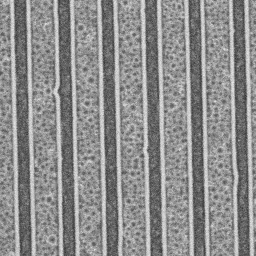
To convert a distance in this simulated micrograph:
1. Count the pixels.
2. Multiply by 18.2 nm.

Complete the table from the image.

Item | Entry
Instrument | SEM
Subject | parallel lines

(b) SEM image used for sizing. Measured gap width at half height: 300 nanometres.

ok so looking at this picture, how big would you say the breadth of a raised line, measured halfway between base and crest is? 0.493 microns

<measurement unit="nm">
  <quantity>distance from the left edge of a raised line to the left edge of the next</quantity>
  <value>793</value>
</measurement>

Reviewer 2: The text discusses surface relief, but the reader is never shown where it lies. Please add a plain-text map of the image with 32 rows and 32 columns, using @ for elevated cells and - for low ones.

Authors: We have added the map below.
@---@@@--@@@---@@@--@@@--@@@@--@
@---@@@--@@@---@@@--@@@--@@@@--@
@---@@@--@@@---@@@--@@@--@@@@--@
@---@@@--@@@---@@@--@@@---@@@--@
@---@@@--@@@---@@@--@@@---@@@--@
@---@@@--@@@---@@@--@@@---@@@--@
@---@@@--@@@---@@@--@@@---@@@--@
@@--@@@--@@@---@@@--@@@---@@@--@
@@--@@@--@@@@--@@@--@@@---@@@--@
@@--@@@--@@@@--@@@--@@@---@@@--@
@@--@@@--@@@---@@@--@@@@--@@@--@
@@--@@@--@@@@--@@@--@@@---@@@--@
@@--@@@--@@@@--@@@--@@@---@@@--@
@@--@@@--@@@@--@@@--@@@---@@@--@
@@--@@@--@@@@--@@@--@@@---@@@--@
@@--@@@--@@@@--@@@--@@@@--@@@--@
@@--@@@--@@@@--@@@--@@@@--@@@--@
@@--@@@--@@@@--@@@--@@@@--@@@--@
@@--@@@--@@@@--@@@--@@@@--@@@--@
@@--@@@---@@@--@@@--@@@@--@@@--@
@@--@@@---@@@--@@@--@@@@--@@@--@
@@--@@@---@@@--@@@--@@@@--@@@--@
@@--@@@---@@@--@@@---@@@--@@@--@
@@--@@@---@@@--@@@---@@@--@@@--@
@@--@@@---@@@--@@@---@@@--@@@--@
@@--@@@---@@@--@@@---@@@--@@@--@
@@--@@@---@@@--@@@---@@@--@@@---
@@--@@@---@@@--@@@---@@@--@@@---
@@--@@@---@@@--@@@---@@@--@@@---
@@--@@@---@@@--@@@---@@@--@@@---
@@--@@@---@@@--@@@---@@@--@@@---
@@--@@@@--@@@--@@@---@@@--@@@---